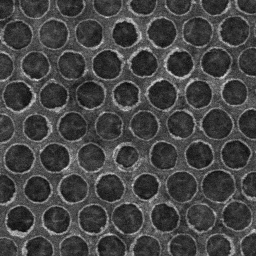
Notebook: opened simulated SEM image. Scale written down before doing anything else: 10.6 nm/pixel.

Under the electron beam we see a regular array of holes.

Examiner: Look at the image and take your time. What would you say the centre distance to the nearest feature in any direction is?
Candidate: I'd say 372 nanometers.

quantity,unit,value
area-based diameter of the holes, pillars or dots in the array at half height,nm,296